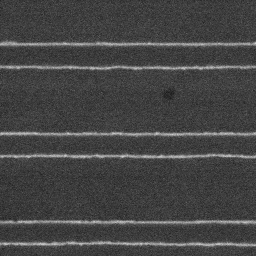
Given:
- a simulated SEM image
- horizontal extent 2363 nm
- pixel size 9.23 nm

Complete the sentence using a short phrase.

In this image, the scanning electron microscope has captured lines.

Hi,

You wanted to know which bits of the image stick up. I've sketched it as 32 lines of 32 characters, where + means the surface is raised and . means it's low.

................................
................................
................................
................................
................................
................................
++++++++++++++++++++++++++++++++
++++++++++++++++++++++++++++++++
...........+++..++...++..+......
................................
................................
................................
................................
................................
................................
................................
................................
++++++++++++++++++++++++++++++++
++++++++++++++++++++++++++++++++
++++++++++++++++++++++++++++++++
................................
................................
................................
................................
................................
................................
................................
................................
++++++++++++++++++++++++++++++++
++++++++++++++++++++++++++++++++
++++++++........++++++++++++++++
................................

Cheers